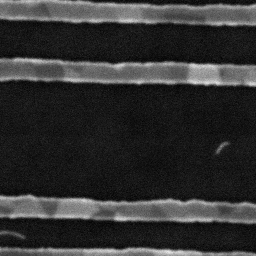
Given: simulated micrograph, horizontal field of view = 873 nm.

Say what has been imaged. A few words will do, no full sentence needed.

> lines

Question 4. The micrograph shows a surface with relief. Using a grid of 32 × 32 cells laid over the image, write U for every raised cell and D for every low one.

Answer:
UUUUUUUUUUUUUUDDDDDDDDDDDDDDDDDD
UUUUUUUUUUUUUUUUUUUUUUUUUUUUUUUU
DDDDDUUUUUUUUUUUUUUUUUUUUUUUUUUU
DDDDDDDDDDDDDDDDDDDDDDDDDDDDDDDD
DDDDDDDDDDDDDDDDDDDDDDDDDDDDDDDD
DDDDDDDDDDDDDDDDDDDDDDDDDDDDDDDD
DDDDDDDDDDDDDDDDDDDDDDDDDDDDDDDD
UUUUUUDDDDDDDDDDDDDDDDDDDDDDDDDD
UUUUUUUUUUUUUUUUUUUUUUUUUUUUUUUU
UUUUUUUUUUUUUUUUUUUUUUUUUUUUUUUU
DDDDDDDDDDDDDDDDDDDDDDDDDDDUUUUU
DDDDDDDDDDDDDDDDDDDDDDDDDDDDDDDD
DDDDDDDDDDDDDDDDDDDDDDDDDDDDDDDD
DDDDDDDDDDDDDDDDDDDDDDDDDDDDDDDD
DDDDDDDDDDDDDDDDDDDDDDDDDDDDDDDD
DDDDDDDDDDDDDDDDDDDDDDDDDDDDDDDD
DDDDDDDDDDDDDDDDDDDDDDDDDDDDDDDD
DDDDDDDDDDDDDDDDDDDDDDDDDDDDDDDD
DDDDDDDDDDDDDDDDDDDDDDDDDDDDDDDD
DDDDDDDDDDDDDDDDDDDDDDDDDDDDDDDD
DDDDDDDDDDDDDDDDDDDDDDDDDDDDDDDD
DDDDDDDDDDDDDDDDDDDDDDDDDDDDDDDD
DDDDDDDDDDDDDDDDDDDDDDDDDDDDDDDD
DDDDDDDDDDDDDDDDDDDDDDDDDDDDDDDD
DDDUDDDDDDDDDDDDDDDDDDDDDDDDDDDD
UUUUUUUUUUUUUUUUUUUUUUUUUUUUUUUU
UUUUUUUUUUUUUUUUUUUUUUUUUUUUUUUU
DDDDDDDDDDDDDDUUDUUUUUUUUUUUUUUU
DDDDDDDDDDDDDDDDDDDDDDDDDDDDDDDD
DDDDDDDDDDDDDDDDDDDDDDDDDDDDDDDD
DDDDDDDDDDDDDDDDDDDDDDDDDDDDDDDD
UUUUUUUUUUUUUUUUUUUUUUUUUDDDDDDD